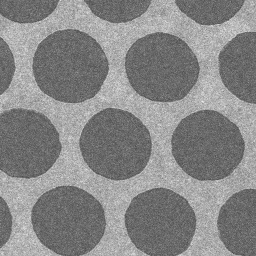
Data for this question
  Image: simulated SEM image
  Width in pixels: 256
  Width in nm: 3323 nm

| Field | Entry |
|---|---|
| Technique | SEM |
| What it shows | holes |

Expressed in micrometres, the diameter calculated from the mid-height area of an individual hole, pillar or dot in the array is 0.938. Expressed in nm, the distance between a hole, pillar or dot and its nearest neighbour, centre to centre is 1170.